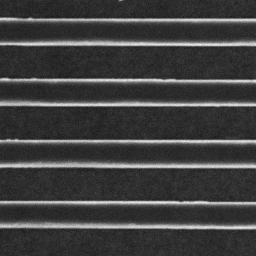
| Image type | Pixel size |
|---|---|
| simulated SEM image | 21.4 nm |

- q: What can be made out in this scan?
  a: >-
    lines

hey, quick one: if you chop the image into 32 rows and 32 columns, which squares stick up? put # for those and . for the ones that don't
................................
................................
#########################.#.....
################################
################################
#######..#...###################
................................
................................
................................
................................
################################
################################
################################
................................
................................
................................
................................
................................
################################
################################
################################
................................
................................
................................
................................
################################
################################
################################
................................
................................
................................
................................